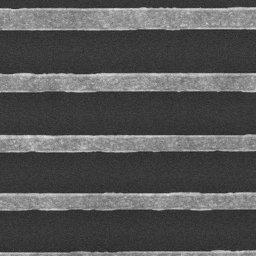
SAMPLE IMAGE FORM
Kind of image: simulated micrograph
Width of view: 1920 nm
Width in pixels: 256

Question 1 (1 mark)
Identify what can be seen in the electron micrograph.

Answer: lines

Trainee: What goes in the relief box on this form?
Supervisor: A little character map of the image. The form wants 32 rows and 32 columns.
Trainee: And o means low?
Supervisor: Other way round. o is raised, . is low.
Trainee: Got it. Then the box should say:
................................
oooooooooooooooooooooooooooooooo
oooooooooooooooooooooooooooooooo
oooooooooooooooooooooooooooooooo
................................
................................
................................
................................
................................
oooooooooooooooooooooooooooooooo
oooooooooooooooooooooooooooooooo
................................
................................
................................
................................
................................
................................
oooooooooooooooooooooooooooooooo
oooooooooooooooooooooooooooooooo
................................
................................
................................
................................
................................
oooooooooooooooooooooooooooooooo
oooooooooooooooooooooooooooooooo
................................
................................
................................
................................
................................
...............................o